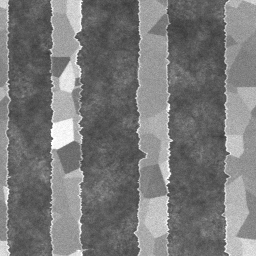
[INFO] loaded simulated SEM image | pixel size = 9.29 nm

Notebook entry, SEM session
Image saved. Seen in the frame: one or a few lines or trenches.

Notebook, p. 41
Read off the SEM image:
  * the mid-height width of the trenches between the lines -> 529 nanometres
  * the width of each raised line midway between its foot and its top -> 0.267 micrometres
